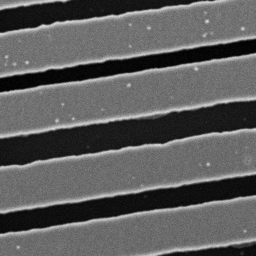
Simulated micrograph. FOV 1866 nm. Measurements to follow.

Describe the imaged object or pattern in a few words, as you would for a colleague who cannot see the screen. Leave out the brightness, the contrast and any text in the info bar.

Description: lines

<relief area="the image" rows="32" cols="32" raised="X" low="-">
XXXXX-------------------XXXXXXXX
----------------XXXXXXXXXXXXXXXX
----------XXXXXXXXXXXXXXXXXXXXXX
----XXXXXXXXXXXXXXXXXXXXXXXXXXXX
XXXXXXXXXXXXXXXXXXXXXXXXXXXXXXXX
XXXXXXXXXXXXXXXXXXXXXXXXXXXX----
XXXXXXXXXXXXXXXXXXXXX-----------
XXXXXXXXXXXXXX------------XXXXXX
XXXXXXXX------------XXXXXXXXXXXX
X-------------XXXXXXXXXXXXXXXXXX
------XXXXXXXXXXXXXXXXXXXXXXXXXX
XXXXXXXXXXXXXXXXXXXXXXXXXXXXXXXX
XXXXXXXXXXXXXXXXXXXXXXXXXXXXXXXX
XXXXXXXXXXXXXXXXXXXXXXXXX-------
XXXXXXXXXXXXXXXXXXX-------------
XXXXXXXXXXXX--------------------
XXXXX------------------------XXX
----------------------XXXXXXXXXX
---------------XXXXXXXXXXXXXXXXX
---------XXXXXXXXXXXXXXXXXXXXXXX
---XXXXXXXXXXXXXXXXXXXXXXXXXXXXX
XXXXXXXXXXXXXXXXXXXXXXXXXXXXXXXX
XXXXXXXXXXXXXXXXXXXXXXXXXXX-----
XXXXXXXXXXXXXXXXXXXX------------
XXXXXXXXXXXXXX-----------------X
XXXXXXXX-----------------XXXXXXX
X----------------XXXXXXXXXXXXXXX
-----------XXXXXXXXXXXXXXXXXXXXX
------XXXXXXXXXXXXXXXXXXXXXXXXXX
XXXXXXXXXXXXXXXXXXXXXXXXXXXXXXXX
XXXXXXXXXXXXXXXXXXXXXXXXXXXXXX--
XXXXXXXXXXXXXXXXXXXXXX----------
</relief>